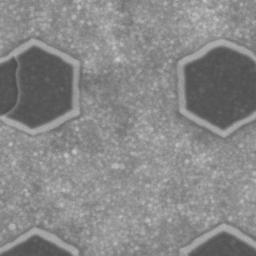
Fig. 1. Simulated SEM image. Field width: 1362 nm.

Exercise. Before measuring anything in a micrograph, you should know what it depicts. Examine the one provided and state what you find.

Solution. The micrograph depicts raised bodies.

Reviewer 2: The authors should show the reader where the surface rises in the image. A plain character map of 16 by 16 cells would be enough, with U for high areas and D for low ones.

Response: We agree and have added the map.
DDDDDDDDDDDDDDDD
DDDDDDDDDDDDDDDD
DDDDDDDDDDDDDDDD
DUUUDDDDDDDDUUUU
UUUUUDDDDDDUUUUU
UUUUUDDDDDDUUUUU
UUUUUDDDDDDUUUUU
UUUUDDDDDDDDUUUD
DDDDDDDDDDDDDDDD
DDDDDDDDDDDDDDDD
DDDDDDDDDDDDDDDD
DDDDDDDDDDDDDDDD
DDDDDDDDDDDDDDDD
DDDDDDDDDDDDDDDD
DDDDDDDDDDDDDUUD
UUUUDDDDDDDDUUUU